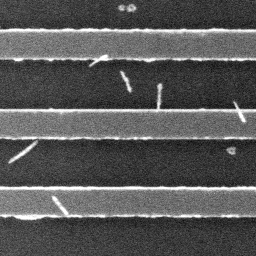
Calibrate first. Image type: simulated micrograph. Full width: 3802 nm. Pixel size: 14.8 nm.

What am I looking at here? lines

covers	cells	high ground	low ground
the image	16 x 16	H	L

LLLLLLLLLLLLLLLL
LLLLLLLLLLLLLLLL
HHHHHHHHHHHHHHHH
HHHHHHHHHHHHHHHH
LLLLLLLLLLLLLLLL
LLLLLLLLLLLLLLLL
LLLLLLLLLLLLLLLL
HHHHHHHHHHHHHHHH
HHHHHHHHHHHHHHHH
LLLLLLLLLLLLLLLL
LLLLLLLLLLLLLLLL
LLLLLLLLLLLLLLLL
HHHHHHHHHHHHHHHH
LHHHHHHHHHHHHHHH
LLLLLLLLLLLLLLLL
LLLLLLLLLLLLLLLL